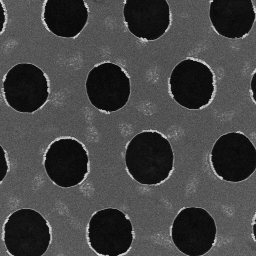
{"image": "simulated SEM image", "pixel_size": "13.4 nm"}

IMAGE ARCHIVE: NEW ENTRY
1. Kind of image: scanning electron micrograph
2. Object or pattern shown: holes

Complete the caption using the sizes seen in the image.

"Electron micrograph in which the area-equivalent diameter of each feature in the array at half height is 622 nm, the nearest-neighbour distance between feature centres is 1100 nm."